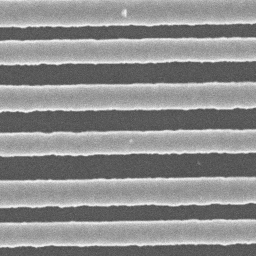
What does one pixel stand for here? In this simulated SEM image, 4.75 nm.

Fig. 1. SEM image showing lines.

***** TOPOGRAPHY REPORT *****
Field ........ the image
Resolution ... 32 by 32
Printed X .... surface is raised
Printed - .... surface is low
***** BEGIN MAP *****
XXXXXXXXXXXXXXXXXXXXXXXXXXXXXXXX
XXXXXXXXXXXXXXXXXXXXXXXXXXXXXXXX
XXXXXXXXXXXXXXXXXXXXXXXXXXXXXXXX
--------------------------------
--------------------------------
XXXXXXXXXXXXXXXXXXXXXXXXXXXXXXXX
XXXXXXXXXXXXXXXXXXXXXXXXXXXXXXXX
XXXXXXXXXXXXXXXXXXXXXXXXXXXXXXXX
--------------------------------
--------------------------------
-------------------XXXXXXXXXXXXX
XXXXXXXXXXXXXXXXXXXXXXXXXXXXXXXX
XXXXXXXXXXXXXXXXXXXXXXXXXXXXXXXX
XXXXXXXXXXXXXXXXXXXXXXXXXXXXXXX-
--------------------------------
--------------------------------
--------------XXX-XXXXXXXXXXXXXX
XXXXXXXXXXXXXXXXXXXXXXXXXXXXXXXX
XXXXXXXXXXXXXXXXXXXXXXXXXXXXXXXX
XX------------------------------
--------------------------------
--------------------------------
-----------XXXXXXXXXXXXXXXXXXXXX
XXXXXXXXXXXXXXXXXXXXXXXXXXXXXXXX
XXXXXXXXXXXXXXXXXXXXXXXXXXXXXXXX
XXXXXXXXXXXXXXXXXXXXXXXXXX------
--------------------------------
---------------------------X--X-
XXXXXXXXXXXXXXXXXXXXXXXXXXXXXXXX
XXXXXXXXXXXXXXXXXXXXXXXXXXXXXXXX
XXXXXXXXXXXXXXXXXXXXXX--X--XX---
--------------------------------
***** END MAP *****